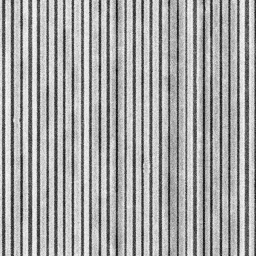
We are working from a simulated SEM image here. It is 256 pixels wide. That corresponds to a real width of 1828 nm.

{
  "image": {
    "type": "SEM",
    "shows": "parallel lines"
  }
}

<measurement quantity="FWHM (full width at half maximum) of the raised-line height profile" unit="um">0.0429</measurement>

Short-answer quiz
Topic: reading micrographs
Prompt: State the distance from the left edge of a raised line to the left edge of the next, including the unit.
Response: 8.7 px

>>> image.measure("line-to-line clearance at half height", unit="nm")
18.8